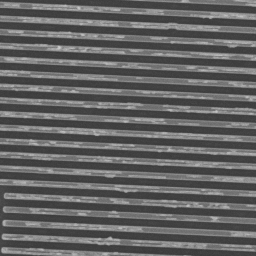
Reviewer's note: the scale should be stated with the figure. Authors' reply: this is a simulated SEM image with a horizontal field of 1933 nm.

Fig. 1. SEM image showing parallel lines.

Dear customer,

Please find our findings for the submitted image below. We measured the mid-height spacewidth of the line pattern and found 60.3 nm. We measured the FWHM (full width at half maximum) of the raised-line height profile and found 40.5 nanometres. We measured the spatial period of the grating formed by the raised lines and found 0.103 µm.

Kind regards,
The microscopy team